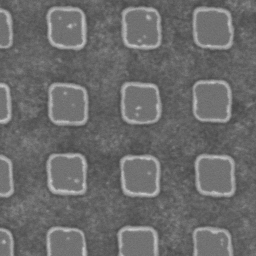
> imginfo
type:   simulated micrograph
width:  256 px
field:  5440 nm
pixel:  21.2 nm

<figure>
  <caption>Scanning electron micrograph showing a regular array of raised bodies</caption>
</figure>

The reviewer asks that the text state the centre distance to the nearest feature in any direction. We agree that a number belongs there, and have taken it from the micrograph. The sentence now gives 1520 nm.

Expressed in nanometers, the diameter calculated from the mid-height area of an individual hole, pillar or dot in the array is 876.